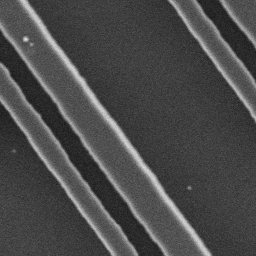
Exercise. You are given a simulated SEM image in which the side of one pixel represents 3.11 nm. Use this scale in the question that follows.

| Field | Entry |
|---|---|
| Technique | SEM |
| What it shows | lines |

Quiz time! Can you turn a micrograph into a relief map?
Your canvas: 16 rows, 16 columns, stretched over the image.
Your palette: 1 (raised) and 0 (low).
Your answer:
1100000000011111
1110000000001111
1110000000001111
1111000000000111
1111100000000011
1111100000000001
1111110000000001
0111111000000000
0011111100000000
0011111100000000
0001111110000000
0000111111000000
0000011111000000
0000011111100000
0000001111110000
0000000111111000